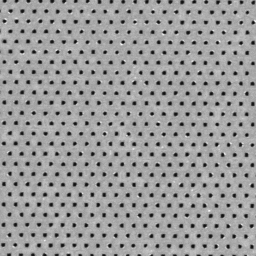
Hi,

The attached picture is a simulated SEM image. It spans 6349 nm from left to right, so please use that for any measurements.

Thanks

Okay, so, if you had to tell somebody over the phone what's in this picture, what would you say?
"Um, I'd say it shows a regular array of holes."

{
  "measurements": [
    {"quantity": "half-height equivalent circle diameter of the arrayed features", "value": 97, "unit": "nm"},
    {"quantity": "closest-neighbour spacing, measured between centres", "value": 285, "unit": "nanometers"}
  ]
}